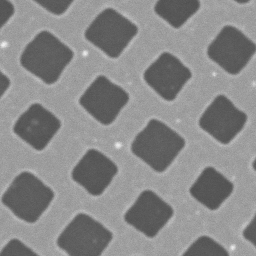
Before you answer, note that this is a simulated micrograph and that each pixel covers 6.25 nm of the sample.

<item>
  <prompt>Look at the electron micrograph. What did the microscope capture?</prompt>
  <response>a regular array of holes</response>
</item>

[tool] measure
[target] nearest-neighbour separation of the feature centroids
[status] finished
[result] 428 nm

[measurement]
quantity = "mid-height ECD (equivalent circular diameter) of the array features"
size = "44.4 pixels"